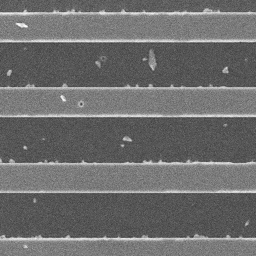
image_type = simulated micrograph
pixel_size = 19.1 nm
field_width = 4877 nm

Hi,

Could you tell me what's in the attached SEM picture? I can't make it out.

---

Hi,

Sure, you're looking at lines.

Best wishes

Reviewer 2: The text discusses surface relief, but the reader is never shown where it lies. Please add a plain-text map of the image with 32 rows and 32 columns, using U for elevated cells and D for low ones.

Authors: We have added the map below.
DDDDDDDDDDDDDDDDDDDDDDDDDDDDDDDD
DDDDDDDDDDDDDDDDDDDDDDDDDDDDDDDD
UUUUUUUUUUUUUUUUUUUUUUUUUUUUUUUU
UUUUUUUUUUUUUUUUUUUUUUUUUUUUUUUU
UUUUUUUUUUUUUUUUUUUUUUUUUUUUUUUU
DDDDDDDDDDDDDDDDDDDDDDDDDDDDDDDD
DDDDDDDDDDDDDDDDDDDDDDDDDDDDDDDD
DDDDDDDDDDDDDDDDDDDDDDDDDDDDDDDD
DDDDDDDDDDDDDDDDDDDDDDDDDDDDDDDD
DDDDDDDDDDDDDDDDDDDDDDDDDDDDDDDD
DDDDDDDDDDDDDDDDDDDDDDDDDDDDDDDD
UUUUUUUUUUUUUUUUUUUUUUUUUUUUUUUU
UUUUUUUUUUUUUUUUUUUUUUUUUUUUUUUU
UUUUUUUUUUUUUUUUUUUUUUUUUUUUUUUU
UUUUUUUUUUUUUUUUUUUUUUUUUUUUUUUU
DDDDDDDDDDDDDDDDDDDDDDDDDDDDDDDD
DDDDDDDDDDDDDDDDDDDDDDDDDDDDDDDD
DDDDDDDDDDDDDDDDDDDDDDDDDDDDDDDD
DDDDDDDDDDDDDDDDDDDDDDDDDDDDDDDD
DDDDDDDDDDDDDDDDDDDDDDDDDDDDDDDD
UUUUUUUUUUUUUUUUUUUUUUUUUUUUUUUU
UUUUUUUUUUUUUUUUUUUUUUUUUUUUUUUU
UUUUUUUUUUUUUUUUUUUUUUUUUUUUUUUU
UUUUUUUUUUUUUUUUUUUUUUUUUUUUUUUU
DDDDDDDDDDDDDDDDDDDDDDDDDDDDDDDD
DDDDDDDDDDDDDDDDDDDDDDDDDDDDDDDD
DDDDDDDDDDDDDDDDDDDDDDDDDDDDDDDD
DDDDDDDDDDDDDDDDDDDDDDDDDDDDDDDD
DDDDDDDDDDDDDDDDDDDDDDDDDDDDDDDD
DDDDDDDDDDDDDDDDDDDDDDDDDDDDDDDD
UUUUUUUUUUUUUUUUUUUUUUUUUUUUUUUU
UUUUUUUUUUUUUUUUUUUUUUUUUUUUUUUU